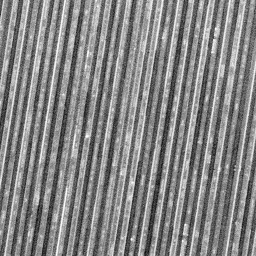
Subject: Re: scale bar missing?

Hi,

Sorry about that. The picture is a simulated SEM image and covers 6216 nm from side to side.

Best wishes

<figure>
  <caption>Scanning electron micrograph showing parallel lines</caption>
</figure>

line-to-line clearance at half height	0.117	µm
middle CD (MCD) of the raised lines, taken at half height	0.117	microns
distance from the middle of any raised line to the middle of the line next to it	247	nanometres